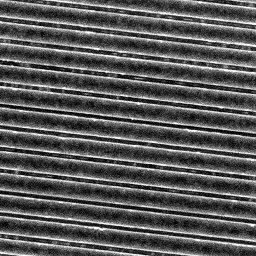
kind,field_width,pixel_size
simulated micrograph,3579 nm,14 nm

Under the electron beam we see parallel lines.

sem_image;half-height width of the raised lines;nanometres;238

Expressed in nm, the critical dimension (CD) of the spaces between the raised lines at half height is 65.9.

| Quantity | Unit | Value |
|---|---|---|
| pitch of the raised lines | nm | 301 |